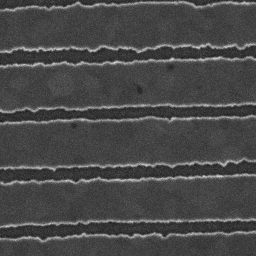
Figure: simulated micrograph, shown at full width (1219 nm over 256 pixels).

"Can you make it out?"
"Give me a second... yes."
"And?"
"parallel lines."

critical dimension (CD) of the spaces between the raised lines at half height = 58.3 nanometres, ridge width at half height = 214 nanometres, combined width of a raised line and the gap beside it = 0.276 um